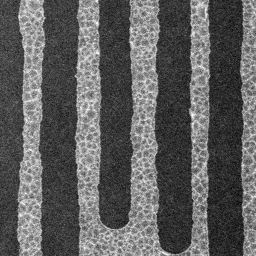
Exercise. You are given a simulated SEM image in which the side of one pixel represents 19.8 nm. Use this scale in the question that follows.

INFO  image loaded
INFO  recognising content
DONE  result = parallel lines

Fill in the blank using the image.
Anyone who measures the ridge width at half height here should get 35.3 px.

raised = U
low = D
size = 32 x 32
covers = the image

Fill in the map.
UUUDUUUUUUDDUUUUDDDDUUUUDDUUUUDD
UUDDDUUUUUDDUUUUDDDDUUUUDUUUUUDD
UUDDDUUUUUDDUUUUUDDDUUUUDDUUUUDD
UUUDDUUUUUDDUUUUDDDDUUUUDDUUUUDD
UUUDDUUUUUDDUUUUDDDDUUUUDDUUUUDD
UUUDDUUUUUDDUUUUDDDDUUUUDDUUUUDD
UUUDDUUUUUDDUUUUUDDDUUUUDDUUUUDD
UUUDDUUUUUDDUUUUDDDUUUUUDDUUUUDD
UUUDDUUUUUDDUUUUDDDUUUUUDDUUUUDD
UUUDDUUUUUDDUUUUUUDUUUUUUUUUUUDD
UUUDDUUUUUDDUUUUUDDUUUUUDUUUUUDD
UUUDDUUUUUDDDUUUUDDUUUUUDDUUUUDD
UUUDDUUUUUDDDUUUUDDUUUUUDDUUUUDD
UUUDDUUUUUDDUUUUUDDUUUUUDDUUUUDD
UUUDDUUUUUDUUUUUUDDUUUUUDDUUUUDD
UUUDDUUUUUUDUUUUUDDUUUUUUDUUUUDD
UUUDDUUUUUDDUUUUDDDUUUUUDDUUUUDD
UUUDDUUUUUDDUUUUDDDUUUUUDDUUUUDD
UUUDDUUUUUDDDUUUUDDDUUUUDDUUUUDD
UUUDDUUUUUDDUUUUUDDUUUUUDDUUUUDD
UUUDDUUUUUDDUUUUDDDUUUUUDDUUUUDD
UUUDDUUUUUDDUUUUDDDUUUUUDDUUUUDD
UUUDDUUUUUDDUUUUDDDUUUUUDDUUUUDD
UUUDDUUUUUDDUUUUDDDDUUUUDDUUUUDD
UUDDDUUUUUDDUUUUDDDDUUUUDDUUUUDD
UUDDDUUUUUDUUUUUDDDDUUUUDDUUUUDD
UUDDDUUUUUDDUUUUUDDDUUUUDDUUUUDD
UUUDDUUUUUDDUUUUDDDDUUUUDDUUUUUU
UUDDDUUUUUDDDDUDDDUDUUUUDDUUUUUD
UUDDDUUUUUDDDDDDDDDDUUUUDDUUUUUD
UUDDDUUUUUDDDDDDDDDDUUUUDDUUUUUD
UUDDDUUUUUDDDDDDDDDDUUUDDDUUUUUD